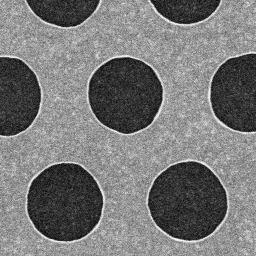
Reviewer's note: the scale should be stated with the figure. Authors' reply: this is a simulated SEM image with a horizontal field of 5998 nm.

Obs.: holes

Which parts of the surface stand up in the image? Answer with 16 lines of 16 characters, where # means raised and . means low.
##....####....##
###..######.####
################
###############.
..####....####..
..####....###...
...###....###...
..####....####..
.###############
################
###..#####...###
##....####....##
##....###.....##
##....###.....##
##....####...###
################